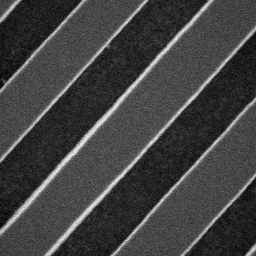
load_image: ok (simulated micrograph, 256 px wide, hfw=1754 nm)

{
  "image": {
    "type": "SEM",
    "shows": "lines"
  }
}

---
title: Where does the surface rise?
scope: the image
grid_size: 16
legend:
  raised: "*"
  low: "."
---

*....****....***
....****....****
...****....****.
..****....****..
.****....*****..
****....*****...
***....*****....
**....*****....*
**...*****....**
*....****....***
....****....****
...****....*****
..****....*****.
.****....*****..
****....*****...
***....*****....